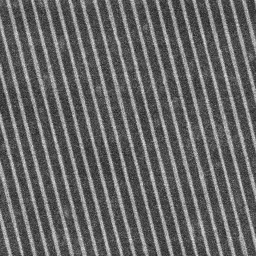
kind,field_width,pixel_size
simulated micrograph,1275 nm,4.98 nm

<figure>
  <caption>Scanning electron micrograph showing parallel lines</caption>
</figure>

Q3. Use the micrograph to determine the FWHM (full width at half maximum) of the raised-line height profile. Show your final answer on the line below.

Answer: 12.7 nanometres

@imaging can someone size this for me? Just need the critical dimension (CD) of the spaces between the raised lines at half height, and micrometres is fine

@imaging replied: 0.0464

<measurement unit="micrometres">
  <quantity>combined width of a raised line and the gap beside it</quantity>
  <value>0.06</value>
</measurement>